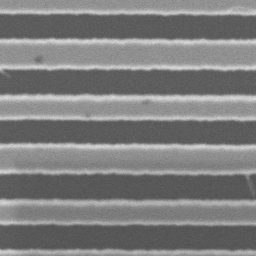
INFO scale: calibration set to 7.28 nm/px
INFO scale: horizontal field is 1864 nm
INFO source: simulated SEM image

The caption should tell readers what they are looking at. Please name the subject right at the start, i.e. lines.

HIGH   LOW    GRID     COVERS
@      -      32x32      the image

@@@@@@@@@@@@@@@@@@@@@@@@@@@@@@@@
@@@@@@@@@@@@@@@@@@@@@@@@@@@@@@@@
--------------------------------
--------------------------------
--------------------------------
@@@@@@@@@@@@@@@@@@@@@@@@@@@@@@@@
@@@@@@@@@@@@@@@@@@@@@@@@@@@@@@@@
@@@@@@@@@@@@@@@@@@@@@@@@@@@@@@@@
@@@@@@@@@@@@@@@@@@@@@@@@@@@@@@@@
--------------------------------
--------------------------------
--------------------------------
@@@@@@@@@@@@@@@@@@@@@@@@@@@@@@@@
@@@@@@@@@@@@@@@@@@@@@@@@@@@@@@@@
@@@@@@@@@@@@@@@@@@@@@@@@@@@@@@@@
--------------------------------
--------------------------------
--------------------------------
@@@@@@@@@@@@@@@@@@@@@@@@@@@@@@@@
@@@@@@@@@@@@@@@@@@@@@@@@@@@@@@@@
@@@@@@@@@@@@@@@@@@@@@@@@@@@@@@@@
@@@@@@@@@@@@@@@@@@@@@@@@@@@@@@@@
--------------------------------
--------------------------------
--------------------------------
@@@@@@@@@@@@@@@@@@@@@@@@@@@@@@@@
@@@@@@@@@@@@@@@@@@@@@@@@@@@@@@@@
@@@@@@@@@@@@@@@@@@@@@@@@@@@@@@@@
--------------------------------
--------------------------------
--------------------------------
@@@@@@@@@@@@@@@@@@@@@@@@@@@@@@@@